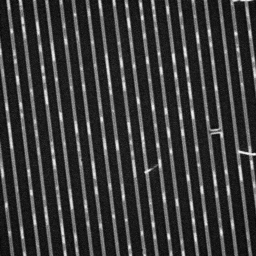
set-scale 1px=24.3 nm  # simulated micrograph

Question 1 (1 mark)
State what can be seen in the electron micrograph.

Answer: parallel lines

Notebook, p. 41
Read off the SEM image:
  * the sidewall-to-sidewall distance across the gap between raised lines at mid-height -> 247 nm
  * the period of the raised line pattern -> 0.319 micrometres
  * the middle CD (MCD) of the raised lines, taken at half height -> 60.2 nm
